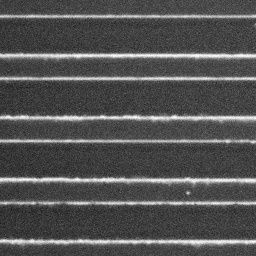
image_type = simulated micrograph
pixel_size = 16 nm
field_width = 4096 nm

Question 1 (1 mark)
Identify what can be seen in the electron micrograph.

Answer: lines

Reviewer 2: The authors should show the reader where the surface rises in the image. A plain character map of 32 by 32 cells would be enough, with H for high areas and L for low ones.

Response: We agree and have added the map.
HHHHHHHHHHHHHHHHHHHHHHHHHHHHHHHH
HHHHHHHHHHHHHHHHHHHHHHHHHHHHHHHH
LLLLLLLLLLLLLLLLLLLLLLLLLLLLLLLL
LLLLLLLLLLLLLLLLLLLLLLLLLLLLLLLL
LLLLLLLLLLLLLLLLLLLLLLLLLLLLLLLL
LLLLLLLLLLLLLLLLLLLLLLLLLLLLLLLL
LLLLLLLLLLLLLLLLLLLLLLLLLLLLLLLL
HHHHHHHHHHHHHHHHHHHHHHHHHHHHHHHH
HHHHHHHHHHHHHHHHHHHHHHHHHHHHHHHH
HHHHHHHHHHHHHHHHHHHHHHHHHHHHHHHH
LLLLLLLLLLLLLLLLLLLLLLLLLLLLLLLL
LLLLLLLLLLLLLLLLLLLLLLLLLLLLLLLL
LLLLLLLLLLLLLLLLLLLLLLLLLLLLLLLL
LLLLLLLLLLLLLLLLLLLLLLLLLLLLLLLL
LLLLLLLLLLLLLLLLLLLLLLLLLLLLLLLL
HHHHHHHHHHHHHHHHHHHHHHHHHHHHHHHH
HHHHHHHHHHHHHHHHHHHHHHHHHHHHHHHH
HHHHHHHHHHHHHHHHHHHHHHHHHHHHHHHH
LLLLLLLLLLLLLLLLLLLLLLLLLLLLLLLL
LLLLLLLLLLLLLLLLLLLLLLLLLLLLLLLL
LLLLLLLLLLLLLLLLLLLLLLLLLLLLLLLL
LLLLLLLLLLLLLLLLLLLLLLLLLLLLLLLL
HHHHHHHHHHHHHHHHHHHHHHHHHHHHHHHL
HHHHHHHHHHHHHHHHHHHHHHHHHHHHHHHH
HHHHHHHHHHHHHHHHHHHHHHHHHHHHHHHH
LLLLLLLLLLLLLLLLLLLLLLLLLLLLLLLL
LLLLLLLLLLLLLLLLLLLLLLLLLLLLLLLL
LLLLLLLLLLLLLLLLLLLLLLLLLLLLLLLL
LLLLLLLLLLLLLLLLLLLLLLLLLLLLLLLL
LLLLLLLLLLLLLLLLLLLLLLLLLLLLLLLL
HHHHHHHHHHHHHHHHHHHHHHHHHHHHHHHH
HHHHHHHHHHHHHHHHHHHHHHHHHHHHHHHH